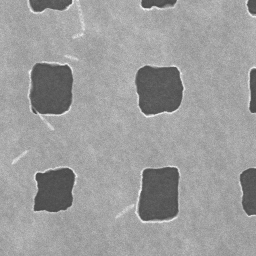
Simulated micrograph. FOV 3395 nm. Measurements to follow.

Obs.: holes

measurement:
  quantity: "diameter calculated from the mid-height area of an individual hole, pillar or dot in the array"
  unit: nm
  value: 659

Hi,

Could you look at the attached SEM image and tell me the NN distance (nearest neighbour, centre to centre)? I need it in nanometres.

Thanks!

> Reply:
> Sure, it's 1370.